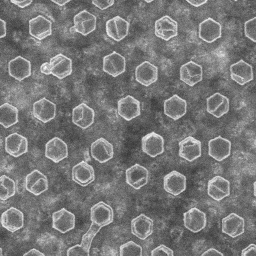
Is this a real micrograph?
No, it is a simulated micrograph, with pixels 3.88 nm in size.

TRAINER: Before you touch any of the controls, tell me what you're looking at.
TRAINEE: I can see a regular array of raised bodies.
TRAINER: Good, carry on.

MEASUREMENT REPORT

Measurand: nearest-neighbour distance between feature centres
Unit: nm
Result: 149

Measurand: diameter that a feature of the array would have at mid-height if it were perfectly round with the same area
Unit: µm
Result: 0.0863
